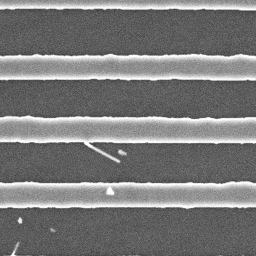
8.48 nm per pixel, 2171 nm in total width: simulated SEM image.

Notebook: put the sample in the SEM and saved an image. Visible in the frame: lines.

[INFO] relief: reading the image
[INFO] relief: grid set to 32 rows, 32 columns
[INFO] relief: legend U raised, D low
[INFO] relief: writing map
UUUUUUUUUUUUUUUUUUUUUUUUUUUUUUUU
DDDDDDDDDDDDDDDDDDDDDDDDDDDDDDDD
DDDDDDDDDDDDDDDDDDDDDDDDDDDDDDDD
DDDDDDDDDDDDDDDDDDDDDDDDDDDDDDDD
DDDDDDDDDDDDDDDDDDDDDDDDDDDDDDDD
DDDDDDDDDDDDDDDDDDDDDDDDDDDDDDDD
DDDDDDDDDDDDDDDDDDDDDDDDDDDDDDDD
UUUUUUUUUUUUUUUUUUUUUUUUUUUUUUUU
UUUUUUUUUUUUUUUUUUUUUUUUUUUUUUUU
UUUUUUUUUUUUUUUUUUUUUUUUUUUUUUUU
DDDDDDDDDDDDDDDDDDDDDDDDDDDDDDDD
DDDDDDDDDDDDDDDDDDDDDDDDDDDDDDDD
DDDDDDDDDDDDDDDDDDDDDDDDDDDDDDDD
DDDDDDDDDDDDDDDDDDDDDDDDDDDDDDDD
DDDDDDDDDDDDDDDDDDDDDDDDDDDDDDDD
UUUUUUUUUUUUUUUUUUUUUUUUUUUUUUUU
UUUUUUUUUUUUUUUUUUUUUUUUUUUUUUUU
UUUUUUUUUUUUUUUUUUUUUUUUUUUUUUUU
DDDDDDDDDDDDDDDDDDDDDDDDDDDDDDDD
DDDDDDDDDDDDDDDDDDDDDDDDDDDDDDDD
DDDDDDDDDDDDDDDDDDDDDDDDDDDDDDDD
DDDDDDDDDDDDDDDDDDDDDDDDDDDDDDDD
DDDDDDDDDDDDDDDDDDDDDDDDDDDDDDDD
UUUUUUUUUUUUUUUUUUUUUUUUUUUUUUUU
UUUUUUUUUUUUUUUUUUUUUUUUUUUUUUUU
UUUUUUUUUUUUUUUUUUUUUUUUUUUUUUUU
DDDDDDDDDDDDDDDDDDDDDDDDDDDDDDDD
DDDDDDDDDDDDDDDDDDDDDDDDDDDDDDDD
DDDDDDDDDDDDDDDDDDDDDDDDDDDDDDDD
DDDDDDDDDDDDDDDDDDDDDDDDDDDDDDDD
DDDDDDDDDDDDDDDDDDDDDDDDDDDDDDDD
DDDDDDDDDDDDDDDDDDDDDDDDDDDDDDDD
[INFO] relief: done